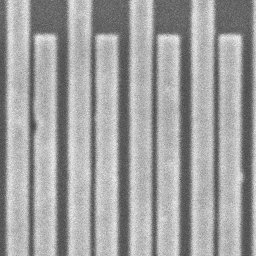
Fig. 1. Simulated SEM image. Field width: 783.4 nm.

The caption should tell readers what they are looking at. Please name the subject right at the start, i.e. parallel lines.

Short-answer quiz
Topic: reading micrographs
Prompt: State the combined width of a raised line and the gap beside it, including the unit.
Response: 92.7 nm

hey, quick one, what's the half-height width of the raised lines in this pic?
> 65.5 nanometers